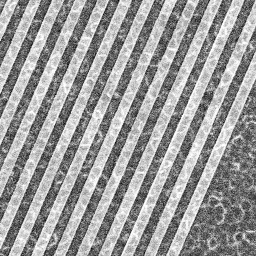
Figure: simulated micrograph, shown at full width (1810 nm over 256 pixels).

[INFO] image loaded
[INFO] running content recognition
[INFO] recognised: parallel lines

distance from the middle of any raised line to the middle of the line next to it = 0.146 um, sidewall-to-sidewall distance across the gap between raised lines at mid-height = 76.9 nanometres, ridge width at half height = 68.9 nanometres